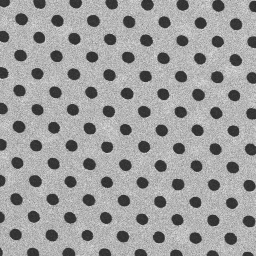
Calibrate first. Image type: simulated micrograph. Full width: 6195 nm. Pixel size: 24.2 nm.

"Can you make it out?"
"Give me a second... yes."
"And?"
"a regular array of holes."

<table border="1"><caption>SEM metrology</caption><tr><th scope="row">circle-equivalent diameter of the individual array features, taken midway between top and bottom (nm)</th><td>285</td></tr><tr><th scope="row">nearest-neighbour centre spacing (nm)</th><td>603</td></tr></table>